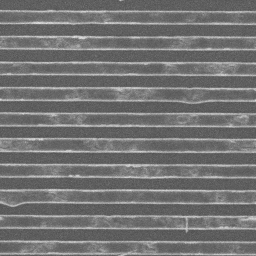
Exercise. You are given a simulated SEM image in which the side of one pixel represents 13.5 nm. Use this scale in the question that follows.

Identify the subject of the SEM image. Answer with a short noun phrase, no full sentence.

parallel lines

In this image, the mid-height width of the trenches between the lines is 0.167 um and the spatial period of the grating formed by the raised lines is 345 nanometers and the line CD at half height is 0.178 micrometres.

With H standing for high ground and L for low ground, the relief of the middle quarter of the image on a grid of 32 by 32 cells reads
HHHHHHHHHHHHHHHHHHHHHHHHHHHHHHHH
HHHHHHHHHHHHHHHHHHHHHHHHHHHHHHHH
HHHHHHHHHHHHHHHHHHHHHHHHHHHHHHHH
LLLLLLLLLLLLLLLLLLLLLLLLLLLLLLLL
LLLLLLLLLLLLLLLLLLLLLLLLLLLLLLLL
LLLLLLLLLLLLLLLLLLLLLLLLLLLLLLLL
HHHHHHHHHHHHHHHHHHHHHHHHHHHHHHHH
HHHHHHHHHHHHHHHHHHHHHHHHHHHHHHHH
HHHHHHHHHHHHHHHHHHHHHHHHHHHHHHHH
LLLLLLLLLLLLLLLLLLLLLLLLLLLLLLHH
LLLLLLLLLLLLLLLLLLLLLLLLLLLLLLLL
LLLLLLLLLLLLLLLLLLLLLLLLLLLLLLLL
HHHHHHHHHHHHHHHHHHHHHHHHHHHHHHHH
HHHHHHHHHHHHHHHHHHHHHHHHHHHHHHHH
HHHHHHHHHHHHHHHHHHHHHHHHHHHHHHHH
LLLLLLLLLLLLLLLLLHHHHHHHHHHHHHHH
LLLLLLLLLLLLLLLLLLLLLLLLLLLLLLLL
LLLLLLLLLLLLLLLLLLLLLLLLLLLLLLLL
LLLLLLLLLLLLLLLLLLLLLLLLLLLLLLLL
HHHHHHHHHHHHHHHHHHHHHHHHHHHHHHHH
HHHHHHHHHHHHHHHHHHHHHHHHHHHHHHHH
HHHHHHHHHHHHHHHHHHHHHHHHHHHHHHHH
LLLLLLLLLLLLLLLLLLLLLLLLLLLLLLLL
LLLLLLLLLLLLLLLLLLLLLLLLLLLLLLLL
LLLLLLLLLLLLLLLLLLLLLLLLLLLLLLLL
HHHHHHHHHHHHHHHHHHHHHHHHHHHHHHHH
HHHHHHHHHHHHHHHHHHHHHHHHHHHHHHHH
HHHHHHHHHHHHHHHHHHHHHHHHHHHHHHHH
LLLLLLLLLLLLLLLLLLLLLLLLLLLLLLLL
LLLLLLLLLLLLLLLLLLLLLLLLLLLLLLLL
LLLLLLLLLLLLLLLLLLLLLLLLLLLLLLLL
LLLLLLLLLLLLLLLLLLLLLLLLLLLLLLLL